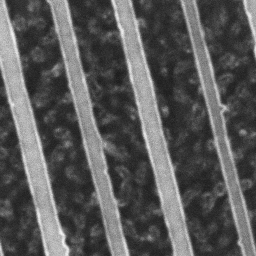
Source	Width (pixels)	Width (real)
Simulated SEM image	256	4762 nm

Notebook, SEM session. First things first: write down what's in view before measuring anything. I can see one or a few lines or trenches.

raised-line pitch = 1.16 microns